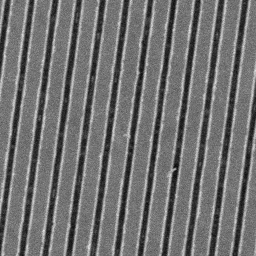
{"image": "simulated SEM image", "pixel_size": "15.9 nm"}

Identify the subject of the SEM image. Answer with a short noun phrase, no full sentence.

parallel lines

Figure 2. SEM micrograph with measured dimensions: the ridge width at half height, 264 nm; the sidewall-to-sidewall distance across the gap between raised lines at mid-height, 105 nm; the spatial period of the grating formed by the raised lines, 375 nanometres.